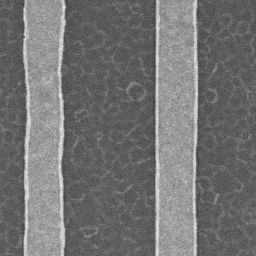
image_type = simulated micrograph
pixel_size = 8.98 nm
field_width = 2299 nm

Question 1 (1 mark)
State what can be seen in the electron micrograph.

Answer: one or a few lines or trenches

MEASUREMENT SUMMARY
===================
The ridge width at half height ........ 337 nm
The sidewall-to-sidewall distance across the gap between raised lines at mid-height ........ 861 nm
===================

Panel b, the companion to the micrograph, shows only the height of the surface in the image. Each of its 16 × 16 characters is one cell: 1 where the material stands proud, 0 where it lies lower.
0011000000110000
0011000000110000
0011000000110000
0011000000110000
0011000000110000
0011000000110000
0011000000110000
0011000000110000
0011000000110000
0011000000110000
0011000000110000
0011000000110000
0011000000110000
0011000000110000
0011000000110000
0011000000110000